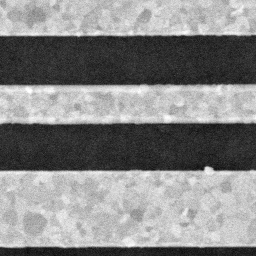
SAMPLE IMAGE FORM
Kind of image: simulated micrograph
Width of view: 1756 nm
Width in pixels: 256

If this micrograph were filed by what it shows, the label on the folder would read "lines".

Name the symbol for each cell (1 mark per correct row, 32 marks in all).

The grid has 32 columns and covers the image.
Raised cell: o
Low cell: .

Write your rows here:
oooooooooooooooooooooooooooooooo
oooooooooooooooooooooooooooooooo
oooooooooooooooooooooooooooooooo
oooooooooooooooooooooooooooooooo
................................
................................
................................
................................
................................
................................
................................
oooooooooooooooooooooooooooooooo
oooooooooooooooooooooooooooooooo
oooooooooooooooooooooooooooooooo
oooooooooooooooooooooooooooooooo
................................
................................
................................
................................
................................
................................
ooooo..ooooooooooooooooooooooooo
oooooooooooooooooooooooooooooooo
oooooooooooooooooooooooooooooooo
oooooooooooooooooooooooooooooooo
oooooooooooooooooooooooooooooooo
oooooooooooooooooooooooooooooooo
oooooooooooooooooooooooooooooooo
oooooooooooooooooooooooooooooooo
oooooooooooooooooooooooooooooooo
oooooooooooooooooooooooooooooooo
................................